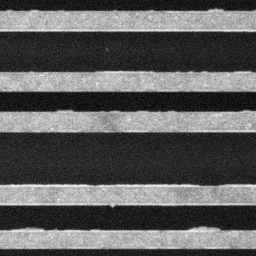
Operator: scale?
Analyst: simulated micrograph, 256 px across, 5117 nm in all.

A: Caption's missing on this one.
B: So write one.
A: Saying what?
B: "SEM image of lines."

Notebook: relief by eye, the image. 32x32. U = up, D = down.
DDDDDDDDDDDDDDDDDDDDDDDDDDDDDDDD
UUUUUUUUUUUUUUUUUUUUUUUUUUUUUUUU
UUUUUUUUUUUUUUUUUUUUUUUUUUUUUUUU
UUUUUUUUUUUUUUUUUUUUUUUUUUUUUUUU
DDDDDDDDDDDDDDDDDDDDDDDDDDDDDDDD
DDDDDDDDDDDDDDDDDDDDDDDDDDDDDDDD
DDDDDDDDDDDDDDDDDDDDDDDDDDDDDDDD
DDDDDDDDDDDDDDDDDDDDDDDDDDDDDDDD
DDDDDDDDDDDDDDDDDDDDDDDDDDDDDDDD
UUUUUUUUUUUUUUUUUUUUUUUUUUUUUUUU
UUUUUUUUUUUUUUUUUUUUUUUUUUUUUUUU
DDDDDDDDDDDDDDDDDDDDDDDDDDDDDDDD
DDDDDDDDDDDDDDDDDDDDDDDDDDDDDDDD
DDDDDDDDDDDDDDDDDDDDDDDDDDDDDDDD
UUUUUUUUUUUUUUUUUUUUUUUUUUUUUUUU
UUUUUUUUUUUUUUUUUUUUUUUUUUUUUUUU
DDDDDDDDDDDDDDDDDDDDDDDDDDDDDDDD
DDDDDDDDDDDDDDDDDDDDDDDDDDDDDDDD
DDDDDDDDDDDDDDDDDDDDDDDDDDDDDDDD
DDDDDDDDDDDDDDDDDDDDDDDDDDDDDDDD
DDDDDDDDDDDDDDDDDDDDDDDDDDDDDDDD
DDDDDDDDDDDDDDDDDDDDDDDDDDDDDDDD
DDDDDDDDDDDDDDDDDDDDDDDDDDDDDDDD
UUUUUUUUUUUUUUUUUUUUUUUUUUUUUUUU
UUUUUUUUUUUUUUUUUUUUUUUUUUUUUUUU
UUUUUUUUUUUUUUUUUUUUUUUUUUUUUUUU
DDDDDDDDDDDDDDDDDDDDDDDDDDDDDDDD
DDDDDDDDDDDDDDDDDDDDDDDDDDDDDDDD
DDDDDDDDDDDDDDDDDDDDDDDDDDDDDDDD
UUUUUUUUUUUUUUUUUUUUUUUUUUUUUUUU
UUUUUUUUUUUUUUUUUUUUUUUUUUUUUUUU
DDDDDDDDDDDDDDDDDDDDDDDDDDDDDDDD